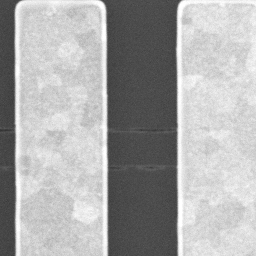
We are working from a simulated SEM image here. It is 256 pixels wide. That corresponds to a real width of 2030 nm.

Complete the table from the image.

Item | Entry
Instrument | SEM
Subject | wiring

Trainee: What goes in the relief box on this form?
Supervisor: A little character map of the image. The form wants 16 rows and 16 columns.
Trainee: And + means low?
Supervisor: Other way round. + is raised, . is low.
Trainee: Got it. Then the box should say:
.+++++.....+++++
.++++++....+++++
.++++++....+++++
.++++++....+++++
.++++++....+++++
.++++++....+++++
.++++++....+++++
.++++++....+++++
.++++++....+++++
.++++++....+++++
.++++++....+++++
.++++++....+++++
.++++++....+++++
.++++++....+++++
.++++++....+++++
.++++++....+++++